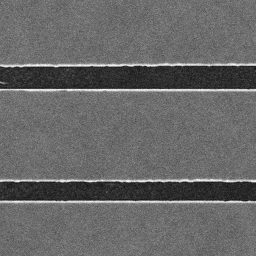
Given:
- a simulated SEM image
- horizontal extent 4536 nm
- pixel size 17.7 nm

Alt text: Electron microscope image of lines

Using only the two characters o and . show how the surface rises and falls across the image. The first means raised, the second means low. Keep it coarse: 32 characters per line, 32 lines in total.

oooooooooooooooooooooooooooooooo
oooooooooooooooooooooooooooooooo
oooooooooooooooooooooooooooooooo
oooooooooooooooooooooooooooooooo
oooooooooooooooooooooooooooooooo
oooooooooooooooooooooooooooooooo
oooooooooooooooooooooooooooooooo
oooooooooooooooooooooooooooooooo
................................
................................
................................
oooooooooooooooooooooooooooooooo
oooooooooooooooooooooooooooooooo
oooooooooooooooooooooooooooooooo
oooooooooooooooooooooooooooooooo
oooooooooooooooooooooooooooooooo
oooooooooooooooooooooooooooooooo
oooooooooooooooooooooooooooooooo
oooooooooooooooooooooooooooooooo
oooooooooooooooooooooooooooooooo
oooooooooooooooooooooooooooooooo
oooooooooooooooooooooooooooooooo
oooooooooooooooooooooooooooooooo
................................
................................
oooooooooooooooooooooooooooooooo
oooooooooooooooooooooooooooooooo
oooooooooooooooooooooooooooooooo
oooooooooooooooooooooooooooooooo
oooooooooooooooooooooooooooooooo
oooooooooooooooooooooooooooooooo
oooooooooooooooooooooooooooooooo